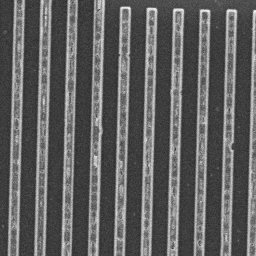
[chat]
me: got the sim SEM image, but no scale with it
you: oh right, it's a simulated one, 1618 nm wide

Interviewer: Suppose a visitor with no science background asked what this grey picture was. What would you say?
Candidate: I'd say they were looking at parallel lines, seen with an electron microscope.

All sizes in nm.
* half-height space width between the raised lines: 111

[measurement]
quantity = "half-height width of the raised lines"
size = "52.9 nm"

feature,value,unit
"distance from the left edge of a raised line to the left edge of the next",26.5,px